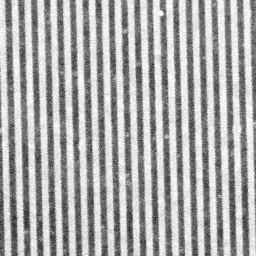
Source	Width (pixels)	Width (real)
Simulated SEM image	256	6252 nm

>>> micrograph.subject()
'parallel lines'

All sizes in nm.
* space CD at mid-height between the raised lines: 183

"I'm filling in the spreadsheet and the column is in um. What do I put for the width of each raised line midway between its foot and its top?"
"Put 0.137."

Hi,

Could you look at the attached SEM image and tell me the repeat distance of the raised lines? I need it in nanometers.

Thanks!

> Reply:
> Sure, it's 314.